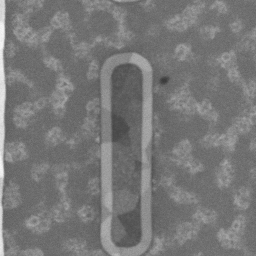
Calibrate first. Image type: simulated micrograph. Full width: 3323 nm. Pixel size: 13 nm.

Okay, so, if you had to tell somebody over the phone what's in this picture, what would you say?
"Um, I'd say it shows one or a few lines or trenches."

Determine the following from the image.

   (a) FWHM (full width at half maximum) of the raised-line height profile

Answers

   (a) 527 nm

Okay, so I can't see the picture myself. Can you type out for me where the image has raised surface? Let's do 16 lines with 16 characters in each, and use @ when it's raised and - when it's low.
----------------
----------------
----------------
----------------
-------@@-------
-------@@-------
-------@@-------
-------@@-------
-------@@-------
-------@@-------
-------@@-------
-------@@-------
-------@@-------
-------@@-------
-------@@-------
-------@@-------